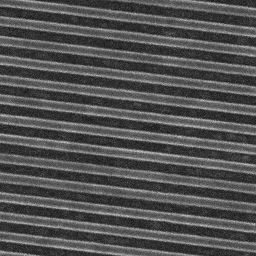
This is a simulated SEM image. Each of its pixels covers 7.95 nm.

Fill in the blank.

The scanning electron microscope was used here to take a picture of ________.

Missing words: parallel lines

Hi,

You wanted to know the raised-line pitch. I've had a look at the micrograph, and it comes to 154 nm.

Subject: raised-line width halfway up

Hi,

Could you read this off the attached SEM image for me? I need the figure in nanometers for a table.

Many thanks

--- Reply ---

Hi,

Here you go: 68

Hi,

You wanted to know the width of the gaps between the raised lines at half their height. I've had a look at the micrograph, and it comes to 11.4 pixels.